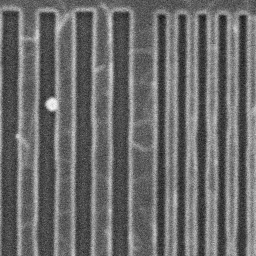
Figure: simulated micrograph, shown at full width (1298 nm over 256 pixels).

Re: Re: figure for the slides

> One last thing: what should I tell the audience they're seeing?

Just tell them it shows groups of lines, slits or small figures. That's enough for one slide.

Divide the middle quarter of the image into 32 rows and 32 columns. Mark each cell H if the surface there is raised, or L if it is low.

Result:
HHHLLLLHHHHHLLLLLHHHHHHLLLHHLLLH
HHHLLLLHHHHHLLLLLHHHHHHLLLHHLLLH
HHLLLLLHHHHHLLLLLHHHHHHLLLHHLLLH
HHLLLLLHHHHHLLLLLHHHHHHLLLHHLLLH
HHLLLLLLHHHHLLLLLHHHHHHLLLHHLLLH
HHLLLLLHHHHHLLLLLHHHHHHLLLHHLLLH
HHLLLLLHHHHHLLLLLHHHHHHLLLHHLLLH
HHLLLLLHHHHHLLLLLHHHHHHLLLHHLLLH
HHLLLLLHHHHHLLLLLHHHHHHLLLHHLLLH
HHHLLLLHHHHHLLLLLHHHHHHLLLHHLLLH
HHHLLLLHHHHHLLLLLHHHHHHLLLHHLLLH
HHHLLLLHHHHHLLLLLHHHHHHLLLHHLLLH
HHHLLLLHHHHHLLLLLHHHHHHLLLHHLLLH
HHHLLLLHHHHHLLLLLHHHHHHLLLHHLLLH
HHHLLLLHHHHHLLLLLHHHHHHLLLHHLLLH
HHHLLLLHHHHHLLLLLHHHHHHLLLHHLLLH
HHHLLLLLHHHHLLLLLHHHHHHLLLHHLLLH
HHLLLLLLHHHHLLLLLHHHHHHLLLHHLLLH
HHLLLLLLHHHHLLLLLHHHHHHLLLHHLLLH
HHLLLLLLHHHHLLLLLHHHHHHLLLHHLLLH
HHLLLLLHHHHHLLLLLHHHHHHLLLHHLLLH
HHLLLLLHHHHHLLLLLHHHHHHLLLHHLLLH
HHLLLLLHHHHHLLLLLHHHHHHLLLHHLLLH
HHLLLLLHHHHHLLLLLHHHHHHLLLHHLLLH
HHLLLLLHHHHHLLLLLHHHHHHLLLHHLLLH
HHLLLLLHHHHHLLLLLHHHHHHLLLHHLLLH
HHLLLLLHHHHHLLLLLHHHHHHLLLHHLLLH
HHLLLLLHHHHHLLLLLHHHHHHLLLHHLLLH
HHLLLLLHHHHHLLLLLHHHHHHLLLHHLLLH
HHLLLLLHHHHHLLLLLHHHHHHLLLHHLLLH
HHLLLLLHHHHHLLLLLHHHHHHLLLHHLLLH
HHLLLLLHHHHHLLLLLHHHHHHLLLHHLLLH